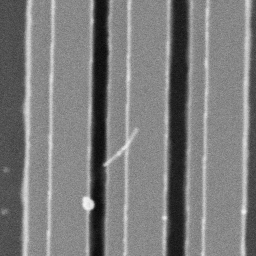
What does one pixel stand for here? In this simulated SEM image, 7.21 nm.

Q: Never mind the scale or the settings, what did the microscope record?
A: lines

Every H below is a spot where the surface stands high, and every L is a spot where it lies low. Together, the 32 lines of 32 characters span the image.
LLLLHHHHHHHHLLHHHHHHHLLLHHHHHHHL
LLLLHHHHHHHHLLHHHHHHHLLLHHHHHHHL
LLLLHHHHHHHHLLHHHHHHHLLLHHHHHHHL
LLLLHHHHHHHLLLHHHHHHHLLLHHHHHHHL
LLLLHHHHHHHLLLHHHHHHHLLLHHHHHHHL
LLLLHHHHHHHLLLHHHHHHHLLLHHHHHHHL
LLLLHHHHHHHLLLHHHHHHHLLLHHHHHHHL
LLLLHHHHHHHLLLHHHHHHHLLLHHHHHHHL
LLLLHHHHHHHLLLHHHHHHHLLLHHHHHHHL
LLLLHHHHHHHLLLHHHHHHHLLLHHHHHHHL
LLLLHHHHHHHLLLHHHHHHHLLLHHHHHHHL
LLLLHHHHHHHLLLHHHHHHHLLLHHHHHHHL
LLLLHHHHHHHLLLHHHHHHHLLLHHHHHHHL
LLLHHHHHHHHLLLHHHHHHHLLLHHHHHHHL
LLLLHHHHHHHLLHHHHHHHHLLLHHHHHHHL
LLLLHHHHHHHLLHHHHHHHHLLLHHHHHHHL
LLLHHHHHHHHLLHHHHHHHHLLLHHHHHHHL
LLLHHHHHHHHLLHHHHHHHHLLLHHHHHHHL
LLLHHHHHHHHLLHHHHHHHHLLLHHHHHHHL
LLLHHHHHHHHLLHHHHHHHHLLLHHHHHHLL
LLLHHHHHHHHLLHHHHHHHHLLLHHHHHHLL
LLLHHHHHHHHLLHHHHHHHHLLHHHHHHHLL
LLLHHHHHHHHLLHHHHHHHHLLHHHHHHHLL
LLLHHHHHHHHLLHHHHHHHHLLHHHHHHHLL
LLLHHHHHHHHLLHHHHHHHHLLHHHHHHHLL
LLLHHHHHHHHHLHHHHHHHHLLHHHHHHHLL
LLLHHHHHHHHLLHHHHHHHHLLHHHHHHHHL
LLLHHHHHHHHLLHHHHHHHHLLHHHHHHHLL
LLLHHHHHHHHLLHHHHHHHHLLHHHHHHHLL
LLLHHHHHHHHLLHHHHHHHHLLHHHHHHHLL
LLLHHHHHHHHLLHHHHHHHHLLHHHHHHHLL
LLLHHHHHHHHLLHHHHHHHHLLHHHHHHHLL